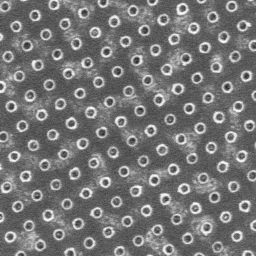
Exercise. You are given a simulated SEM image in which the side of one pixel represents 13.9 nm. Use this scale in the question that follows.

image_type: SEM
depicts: a regular array of raised bodies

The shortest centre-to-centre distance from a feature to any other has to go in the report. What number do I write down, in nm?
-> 302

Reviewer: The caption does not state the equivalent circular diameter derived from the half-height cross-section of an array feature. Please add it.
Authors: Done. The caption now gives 140 nanometres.